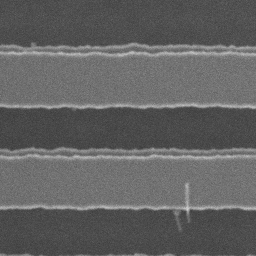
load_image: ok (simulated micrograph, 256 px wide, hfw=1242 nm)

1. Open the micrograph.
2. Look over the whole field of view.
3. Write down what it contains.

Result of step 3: lines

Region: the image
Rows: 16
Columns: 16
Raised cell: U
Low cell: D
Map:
DDDDDDDDDDDDDDDD
DDDDDDDDDDDDDDDD
DDDDDDDDDDDDDDDD
UUUUUUUUUUUUUUUU
UUUUUUUUUUUUUUUU
UUUUUUUUUUUUUUUU
UUUUUUUUUUUUUUUU
DDDDDDDDDDDDDDDD
DDDDDDDDDDDDDDDD
UUUUUUUUUUUUUUUU
UUUUUUUUUUUUUUUU
UUUUUUUUUUUUUUUU
UUUUUUUUUUUUUUUU
DDDDDDDDDDDDDDDD
DDDDDDDDDDDDDDDD
DDDDDDDDDDDDDDDD